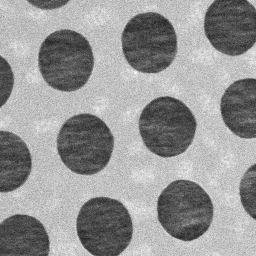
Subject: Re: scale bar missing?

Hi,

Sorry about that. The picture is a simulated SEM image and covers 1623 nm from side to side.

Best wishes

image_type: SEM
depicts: holes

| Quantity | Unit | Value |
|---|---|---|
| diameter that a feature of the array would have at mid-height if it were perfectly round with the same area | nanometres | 373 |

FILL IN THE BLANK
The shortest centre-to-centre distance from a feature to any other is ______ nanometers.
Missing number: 540